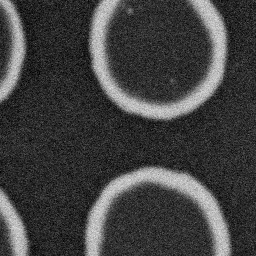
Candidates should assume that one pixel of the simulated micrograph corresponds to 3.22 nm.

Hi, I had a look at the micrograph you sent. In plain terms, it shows raised bodies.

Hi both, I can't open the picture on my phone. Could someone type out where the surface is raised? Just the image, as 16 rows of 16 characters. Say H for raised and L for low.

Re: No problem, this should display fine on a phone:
HLLLLLLHHHHHHLLL
HLLLLLHHHHHHHHLL
HLLLLLHHHHHHHHLL
HLLLLLHHHHHHHHLL
HLLLLLHHHHHHHHLL
HLLLLLLHHHHHHLLL
LLLLLLLLHHHHLLLL
LLLLLLLLLLLLLLLL
LLLLLLLLLLLLLLLL
LLLLLLLLLLLLLLLL
LLLLLLLLLLLLLLLL
LLLLLLLHHHHHLLLL
LLLLLLHHHHHHHLLL
HLLLLLHHHHHHHLLL
HLLLLLHHHHHHHHLL
HLLLLLHHHHHHHHLL